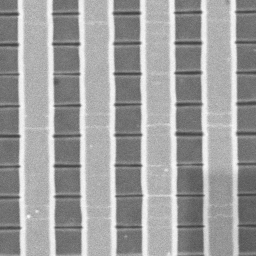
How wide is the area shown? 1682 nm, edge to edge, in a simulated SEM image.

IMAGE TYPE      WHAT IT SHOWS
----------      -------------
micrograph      wiring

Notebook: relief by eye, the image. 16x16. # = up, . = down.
.##..##..##..##.
.##..##..##..##.
.##..##..##..##.
.##..##..##..##.
.##..##..##..##.
.##..##..##..##.
.##..##..##..##.
.##..##..##..##.
.##..##..##..##.
.##..##..##..##.
.##..##..##..##.
.##..##..##..##.
.##..##..##..##.
.##..##..##..##.
.##..##..##..##.
.##..##..##..##.